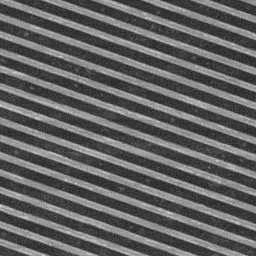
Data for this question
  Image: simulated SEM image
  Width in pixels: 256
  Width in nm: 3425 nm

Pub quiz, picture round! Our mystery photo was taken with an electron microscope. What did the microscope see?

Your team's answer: parallel lines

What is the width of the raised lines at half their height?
75.7 nm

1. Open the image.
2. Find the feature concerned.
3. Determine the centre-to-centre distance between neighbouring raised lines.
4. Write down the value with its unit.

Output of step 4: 0.219 um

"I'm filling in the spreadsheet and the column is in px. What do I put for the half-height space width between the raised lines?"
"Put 11.2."